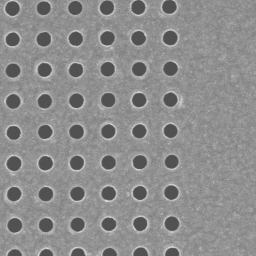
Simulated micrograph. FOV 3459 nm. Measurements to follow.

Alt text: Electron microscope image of a regular array of holes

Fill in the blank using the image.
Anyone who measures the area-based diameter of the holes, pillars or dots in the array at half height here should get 195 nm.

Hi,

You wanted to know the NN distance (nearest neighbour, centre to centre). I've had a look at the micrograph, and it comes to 416 nm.